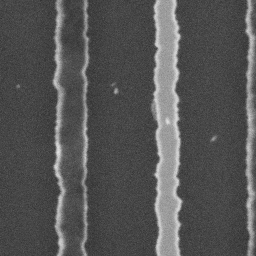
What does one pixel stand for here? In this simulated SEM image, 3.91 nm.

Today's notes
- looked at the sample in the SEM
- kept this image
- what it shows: lines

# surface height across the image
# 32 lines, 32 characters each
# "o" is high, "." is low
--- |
.......oooo........ooo.........o
.......oooo........ooo.........o
.......oooo........ooo.........o
.......oooo.........oo.........o
.......oooo.........oo.........o
.......oooo........ooo.........o
.......oooo.........oo.........o
.......oooo........ooo.........o
.......oooo........ooo.........o
.......oooo........ooo.........o
.......oooo........ooo.........o
.......oooo........ooo.........o
........ooo........ooo.........o
.......oooo.........oo.........o
.......oooo.........oo.........o
.......oooo.........oo.........o
.......oooo.........oo.........o
.......oooo.........oo.........o
.......oooo.........oo.........o
.......oooo.........oo.........o
.......oooo.........oo.........o
.......oooo.........oo.........o
.......oooo.........oo.........o
........ooo.........oo.........o
........ooo.........oo.........o
.......oooo........oooo........o
.......oooo........ooo.........o
.......oooo.........oo.........o
.......oooo.........oo.........o
........ooo.........oo.........o
........oo..........oo.........o
........ooo.........oo.........o